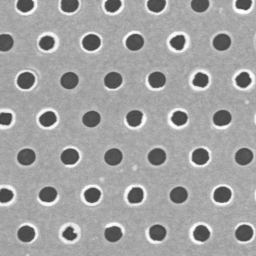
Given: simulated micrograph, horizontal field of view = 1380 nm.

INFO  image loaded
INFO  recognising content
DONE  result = a regular array of holes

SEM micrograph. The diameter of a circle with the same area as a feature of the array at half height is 91.3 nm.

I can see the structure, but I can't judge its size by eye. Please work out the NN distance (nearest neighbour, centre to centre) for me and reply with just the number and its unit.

233 nm